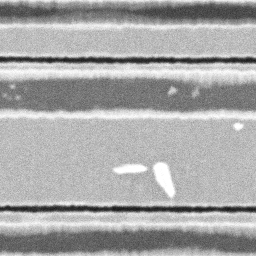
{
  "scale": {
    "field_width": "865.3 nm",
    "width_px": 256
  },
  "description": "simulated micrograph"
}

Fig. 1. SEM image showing lines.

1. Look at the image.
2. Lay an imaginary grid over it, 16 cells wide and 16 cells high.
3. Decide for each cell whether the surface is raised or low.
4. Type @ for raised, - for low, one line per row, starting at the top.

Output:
----------------
---@@@@@--------
@@@@@@@@@@@@@@@@
@@@@@@@@@@@@@@@@
@@@@@@@@@@@@@@@@
----------------
----------------
@@@@@@@@@@@@@@@@
@@@@@@@@@@@@@@@@
@@@@@@@@@@@@@@@@
@@@@@@@@@@@@@@@@
@@@@@@@@@@@@@@@@
@@@@@@@@@@@@@@@@
@@@@@@@@@@@@@@@@
----------------
----------------